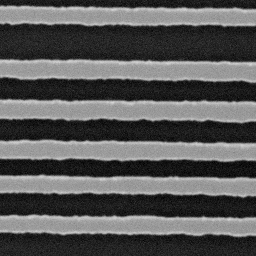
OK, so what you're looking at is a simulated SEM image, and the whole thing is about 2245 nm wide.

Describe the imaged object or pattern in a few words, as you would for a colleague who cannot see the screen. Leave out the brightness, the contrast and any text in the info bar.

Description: lines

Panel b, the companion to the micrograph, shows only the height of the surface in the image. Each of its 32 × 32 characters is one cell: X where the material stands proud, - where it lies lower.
--------------------------------
XXXXXXXXXXXXXXXXXXXXXXXXXXXXXXXX
XXXXXXXXXXXXXXXXXXXXXXXXXXXXXXXX
--------------------------------
--------------------------------
--------------------------------
--------------------------------
--------------------------------
XXXXXXXXXXXXXXXXXXXXXXXXXXXXXXXX
XXXXXXXXXXXXXXXXXXXXXXXXXXXXXXXX
--------------------------------
--------------------------------
--------------------------------
XXXXXXXXXXXXXXXXXXXXXXXXXXXXXXXX
XXXXXXXXXXXXXXXXXXXXXXXXXXXXXXXX
--------------------------------
--------------------------------
--------------------------------
XXXXXXXXXXXXXXXXXXXXXXXXXXXXXXXX
XXXXXXXXXXXXXXXXXXXXXXXXXXXXXXXX
--------------------------------
--------------------------------
XXXXXXXXXXXXXXXXXXXXXXXXXXXXXXXX
XXXXXXXXXXXXXXXXXXXXXXXXXXXXXXXX
--------------------------------
--------------------------------
--------------------------------
XXXXXXXXXXXXXXXXXXXXXXXXXXXXXXXX
XXXXXXXXXXXXXXXXXXXXXXXXXXXXXXXX
--------------------------------
--------------------------------
--------------------------------